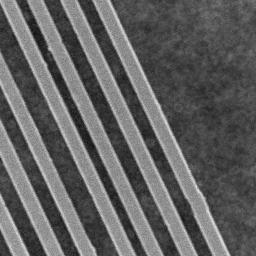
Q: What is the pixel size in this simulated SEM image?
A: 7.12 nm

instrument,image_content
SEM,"parallel lines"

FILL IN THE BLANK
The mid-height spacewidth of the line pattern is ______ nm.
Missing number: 118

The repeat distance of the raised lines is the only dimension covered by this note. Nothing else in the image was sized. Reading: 210 nm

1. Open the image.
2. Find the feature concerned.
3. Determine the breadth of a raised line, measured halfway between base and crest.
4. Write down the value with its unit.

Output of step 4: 12.7 pixels